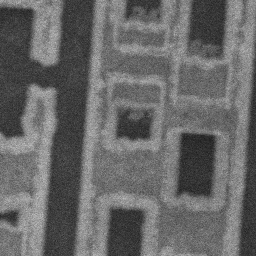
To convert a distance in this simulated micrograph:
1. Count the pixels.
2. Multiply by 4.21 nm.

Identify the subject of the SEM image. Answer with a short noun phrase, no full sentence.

one or a few lines or trenches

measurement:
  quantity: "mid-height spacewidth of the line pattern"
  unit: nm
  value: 190